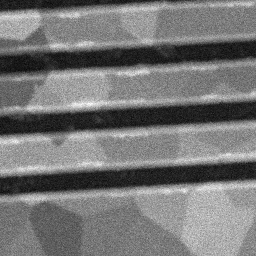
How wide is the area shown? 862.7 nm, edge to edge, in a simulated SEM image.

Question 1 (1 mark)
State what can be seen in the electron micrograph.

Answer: one or a few lines or trenches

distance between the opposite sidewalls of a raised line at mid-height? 112 nm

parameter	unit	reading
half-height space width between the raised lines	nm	94.1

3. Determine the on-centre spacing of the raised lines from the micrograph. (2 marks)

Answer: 206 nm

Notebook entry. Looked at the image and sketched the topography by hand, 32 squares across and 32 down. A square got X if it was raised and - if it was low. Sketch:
--------------------------XXXXXX
---------XXXXXXXXXXXXXXXXXXXXXXX
XXXXXXXXXXXXXXXXXXXXXXXXXXXXXXXX
XXXXXXXXXXXXXXXXXXXXXXXXXXXXXXXX
XXXXXXXXXXXXXXXXXXXXXXXXXXXXXXX-
XXXXXXXXXXXXXX------------------
--------------------------------
--------------------------------
----------------------XXXXXXXXXX
----X-XXXXXXXXXXXXXXXXXXXXXXXXXX
XXXXXXXXXXXXXXXXXXXXXXXXXXXXXXXX
XXXXXXXXXXXXXXXXXXXXXXXXXXXXXXXX
XXXXXXXXXXXXXXXXXXXXXXX---------
XXXXXXX-------------------------
--------------------------------
--------------------------------
-----------------XXXXXXXXXXXXXXX
XXXXXXXXXXXXXXXXXXXXXXXXXXXXXXXX
XXXXXXXXXXXXXXXXXXXXXXXXXXXXXXXX
XXXXXXXXXXXXXXXXXXXXXXXXXXXXXXXX
XXXXXXXXXXXXXXXX----------------
--------------------------------
--------------------------------
------------------------XXXXXXXX
--------XXXXXXXXXXXXXXXXXXXXXXXX
XXXXXXXXXXXXXXXXXXXXXXXXXXXXXXXX
XXXXXXXXXXXXXXXXXXXXXXXXXXXXXXXX
XXXXXXXXXXXXXXXXXXXXXXXXXXXXXXXX
XXXXXXXXXXXXXXXXXXXXXXXXXXXXXXXX
XXXXXXXXXXXXXXXXXXXXXXXXXXXXXXXX
XXXXXXXXXXXXXXXXXXXXXXXXXXXXXXXX
XXXXXXXXXXXXXXXXXXXXXXXXXXXXXXXX